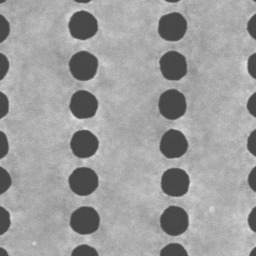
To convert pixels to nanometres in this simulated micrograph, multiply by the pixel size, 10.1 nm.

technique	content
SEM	a regular array of holes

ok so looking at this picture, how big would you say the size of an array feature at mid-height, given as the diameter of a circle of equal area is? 297 nanometres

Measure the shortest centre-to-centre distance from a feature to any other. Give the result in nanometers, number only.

390